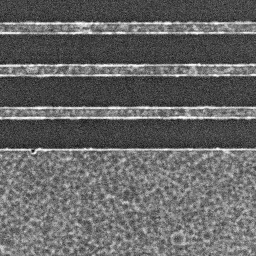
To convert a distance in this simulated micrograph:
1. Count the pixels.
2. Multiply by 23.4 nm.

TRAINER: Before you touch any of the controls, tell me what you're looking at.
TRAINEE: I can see parallel lines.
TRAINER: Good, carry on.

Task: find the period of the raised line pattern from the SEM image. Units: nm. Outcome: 992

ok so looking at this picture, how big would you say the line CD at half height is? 242 nm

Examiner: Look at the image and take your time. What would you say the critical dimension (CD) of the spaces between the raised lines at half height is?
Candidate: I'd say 31.6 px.